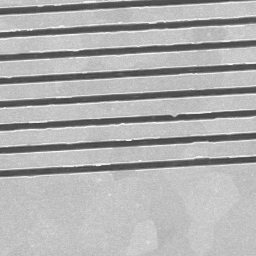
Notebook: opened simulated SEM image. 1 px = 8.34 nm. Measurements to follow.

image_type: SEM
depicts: parallel lines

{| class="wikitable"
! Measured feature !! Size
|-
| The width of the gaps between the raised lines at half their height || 0.05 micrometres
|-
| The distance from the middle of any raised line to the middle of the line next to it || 193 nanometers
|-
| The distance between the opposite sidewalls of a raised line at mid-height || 145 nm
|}